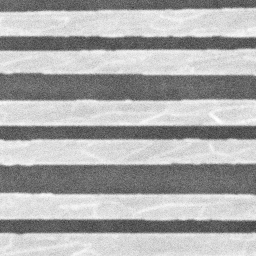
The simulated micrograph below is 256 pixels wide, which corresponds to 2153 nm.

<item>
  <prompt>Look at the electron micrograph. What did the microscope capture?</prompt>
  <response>lines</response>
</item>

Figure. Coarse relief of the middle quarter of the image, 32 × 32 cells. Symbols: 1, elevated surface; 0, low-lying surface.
11111111111111111111111111111111
11111111111111111111111111111111
00000000000000000000000000000000
00000000000000000000000000000000
00000000000000000000000000000000
00000000000000000000000000000000
00000000000000000000000000000000
00000000000000000000000000000000
00000000000000000000000000000000
11111111111111111111111111111111
11111111111111111111111111111111
11111111111111111111111111111111
11111111111111111111111111111111
11111111111111111111111111111111
11111111111111111111111111111111
00000000000000000000000000000000
00000000000000000000000000000000
00000000000000000000000000000000
00000000000000000000000000000000
11111111111111111111111111111111
11111111111111111111111111111111
11111111111111111111111111111111
11111111111111111111111111111111
11111111111111111111111111111111
11111111111111111111111111111111
00000000000000000000000000000000
00000000000000000000000000000000
00000000000000000000000000000000
00000000000000000000000000000000
00000000000000000000000000000000
00000000000000000000000000000000
00000000000000000000000000000000